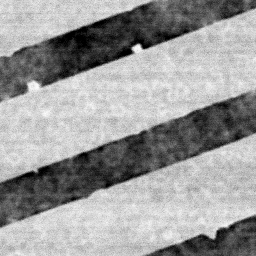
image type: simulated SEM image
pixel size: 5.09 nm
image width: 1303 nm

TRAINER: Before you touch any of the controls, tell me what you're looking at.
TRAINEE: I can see one or a few lines or trenches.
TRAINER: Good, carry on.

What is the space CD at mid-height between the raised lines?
220 nanometers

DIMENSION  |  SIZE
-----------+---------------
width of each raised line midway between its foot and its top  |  0.377 µm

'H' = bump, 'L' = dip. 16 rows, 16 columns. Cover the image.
HHHHHHHHLLLLLLLL
HHHHHHLLLLLLLLHH
HHHLLLLLLLLHHHHH
LLLLLLLLHHHHHHHH
LLLLLHHHHHHHHHHH
LLHHHHHHHHHHHHHH
HHHHHHHHHHHHHLLL
HHHHHHHHHHHLLLLL
HHHHHHHHLLLLLLLL
HHHHHLLLLLLLLHHH
HHLLLLLLLLHHHHHH
LLLLLLLHHHHHHHHH
LLLLLHHHHHHHHHHH
LLHHHHHHHHHHHHHH
HHHHHHHHHHHHHHLL
HHHHHHHHHHLLLLLL